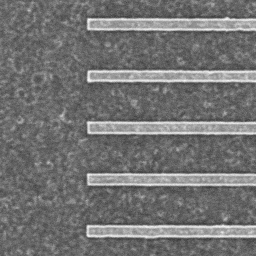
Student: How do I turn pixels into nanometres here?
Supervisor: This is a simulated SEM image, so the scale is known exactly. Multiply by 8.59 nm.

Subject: parallel lines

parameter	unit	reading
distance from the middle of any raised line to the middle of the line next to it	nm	444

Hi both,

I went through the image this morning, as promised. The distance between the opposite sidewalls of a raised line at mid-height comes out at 89.1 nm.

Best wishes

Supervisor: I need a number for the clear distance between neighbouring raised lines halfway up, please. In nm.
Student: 355